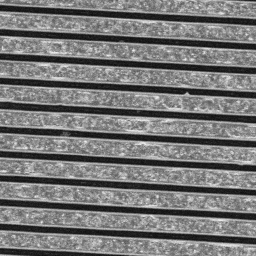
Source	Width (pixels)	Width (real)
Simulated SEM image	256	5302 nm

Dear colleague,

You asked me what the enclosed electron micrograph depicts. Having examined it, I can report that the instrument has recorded parallel lines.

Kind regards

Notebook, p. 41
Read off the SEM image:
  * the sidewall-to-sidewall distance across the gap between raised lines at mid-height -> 150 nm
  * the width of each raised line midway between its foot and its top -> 0.354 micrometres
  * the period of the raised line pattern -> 502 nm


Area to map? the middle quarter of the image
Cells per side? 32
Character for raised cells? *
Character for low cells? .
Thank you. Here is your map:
******..........................
************************........
********************************
********************************
.....***************************
..........................******
*****...........................
**********************........*.
********************************
********************************
.......*************************
.....................***.*******
***.............................
*********************...........
********************************
********************************
..******************************
....................************
**..............................
********************............
********************************
********************************
.*******************************
...................*************
*...............................
******************..............
********************************
********************************
**..****************************
..................**************
................................
*****************...............